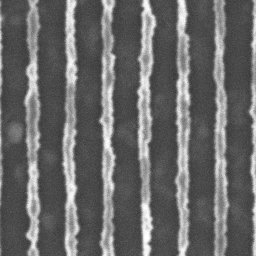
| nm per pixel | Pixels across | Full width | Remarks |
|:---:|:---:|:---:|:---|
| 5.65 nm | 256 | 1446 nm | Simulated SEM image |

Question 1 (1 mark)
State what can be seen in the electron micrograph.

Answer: parallel lines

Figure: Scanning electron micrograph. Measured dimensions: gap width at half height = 162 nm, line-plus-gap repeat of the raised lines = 211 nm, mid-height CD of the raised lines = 8.88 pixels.